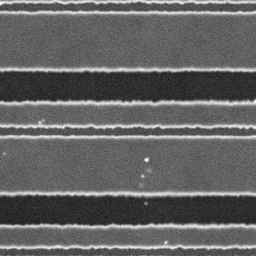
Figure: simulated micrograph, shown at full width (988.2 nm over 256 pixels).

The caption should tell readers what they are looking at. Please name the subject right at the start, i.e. lines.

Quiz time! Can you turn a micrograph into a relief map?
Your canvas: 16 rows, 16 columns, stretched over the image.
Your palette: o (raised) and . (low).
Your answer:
oooooooooooooooo
oooooooooooooooo
oooooooooooooooo
oooooooooooooooo
................
................
oooooooooooooooo
oooooooooooooooo
oooooooooooooooo
oooooooooooooooo
oooooooooooooooo
oooooooooooooooo
................
................
oooooooooooooooo
oooooooooooooooo